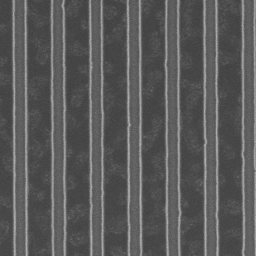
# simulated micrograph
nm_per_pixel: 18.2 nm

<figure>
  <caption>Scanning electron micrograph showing parallel lines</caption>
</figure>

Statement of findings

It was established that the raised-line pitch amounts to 0.696 micrometres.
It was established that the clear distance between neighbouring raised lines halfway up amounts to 11.4 px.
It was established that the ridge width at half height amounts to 483 nanometres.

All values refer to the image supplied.